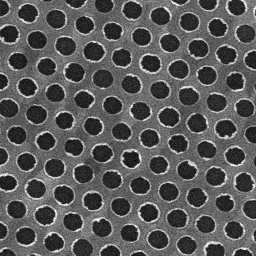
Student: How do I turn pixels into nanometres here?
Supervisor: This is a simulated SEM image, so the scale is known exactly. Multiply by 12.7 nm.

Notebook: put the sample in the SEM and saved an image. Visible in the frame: a regular array of holes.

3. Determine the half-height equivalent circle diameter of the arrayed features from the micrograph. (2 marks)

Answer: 236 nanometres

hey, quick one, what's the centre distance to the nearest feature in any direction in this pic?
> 354 nm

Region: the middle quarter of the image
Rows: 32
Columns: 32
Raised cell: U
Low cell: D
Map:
UDDDUUUUUUUUUUDDUUUDDDDDUUDDDDDU
DDDDDUUUUDDUUUUUUUUUUDDDUUDDDDDU
DDDDDUUDDDDDUUUUUUUUUUUUUUUDDDDU
UDDDDUUDDDDDUUUDDDUUUUUUUUUUDDUU
UUUDUUUDDDDDUUDDDDDUUUUDDUUUUUUU
UUUUUUUUDDDDUUDDDDDUUUDDDDUUUUUU
UUUUUUUUUUUUUUUDDDDUUDDDDDUUUDDD
UUUDDDUUUUUUUUUUUUUUUUDDDDUUUDDD
UUUDDDDUUUUDDUUUUUUUUUUDDDUUUDDD
UUUDDDDUUUDDDDUUUUUDUUUUUUUUUDDD
UUUDDDUUUUDDDDDUUDDDDUUUUUUUUUUU
UUUUUUUUUUDDDDUUUDDDDDUUUDDDUUUU
DDUUUUUUUUUUDUUUUDDDDDUUDDDDDUUU
DDUUUUDUUUUUUUUUUUDDDUUUDDDDDUUD
DDUUUDDDDUUUUUUUUUUUUUUUDDDDDUUD
DDUUUDDDDDUUUDDDUUUUUUUUUUDDUUUD
UUUUUDDDDUUUDDDDDUUUDDUUUUUUUUUU
UUUUUUDDUUUUDDDDDUUDDDDUUUUUUUUU
UUUUUUUUUUUUUDDDUUUDDDDDUUUDDDUU
DDDDUUUUUUUUUUUUUUUDDDDDUUDDDDDU
DDDDDUUUDDDUUUUUUUUUDDDUUUDDDDDU
DDDDDUUDDDDDUUUUUUUUUUUUUUUDDDUU
UUDDUUUDDDDDUUUDDDDUUUUUUUUUUUUU
UUUUUUUDDDDDUUUDDDDUUUDDDUUUUUUU
UUUUUUUUUDUUUUUDDDDUUDDDDDUUUUDU
UUUUDDUUUUUUUUUUDDUUUDDDDDUUDDDD
UUUDDDDUUUUUUUUUUUUUUUDDDUUUDDDD
UUUDDDDUUUDDDDUUUUUUUUUUUUUUUDDD
UUUDDDDUUDDDDDUUUUDDUUUUUUUUUDDD
UUUUDDUUUUDDDDUUUDDDDUUUUUUUUUUU
DUUUUUUUUUDDDDUUUDDDDUUUDDDDUUUU
DDUUUUUUUUUUUUUUUDDDDUUUDDDDDUUU